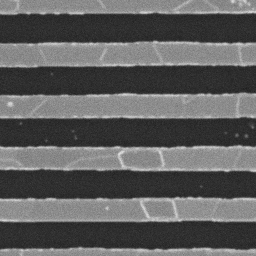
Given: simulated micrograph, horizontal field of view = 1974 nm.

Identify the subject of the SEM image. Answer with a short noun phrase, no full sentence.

lines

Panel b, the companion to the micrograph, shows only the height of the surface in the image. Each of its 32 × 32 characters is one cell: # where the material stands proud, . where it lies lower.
################################
###############################.
................................
................................
................................
.....######################.####
################################
################################
................................
................................
................................
................................
################################
################################
################################
................................
................................
................................
#..####.......#.......#.########
################################
################################
................................
................................
................................
................................
################################
################################
######################.....#####
................................
................................
................................
################################